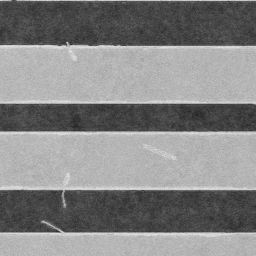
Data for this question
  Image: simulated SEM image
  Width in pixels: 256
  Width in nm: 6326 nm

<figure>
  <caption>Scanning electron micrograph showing lines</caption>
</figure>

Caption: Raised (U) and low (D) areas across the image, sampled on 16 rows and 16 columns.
DDDDDDDDDDDDDDDD
DDDDDDDDDDDDDDDD
DDDDDDDDDDDDDDDD
UUUUUUUUUUUUUUUU
UUUUUUUUUUUUUUUU
UUUUUUUUUUUUUUUU
DDDDDDDDDDDDDDDD
DDDDDDDDDDDDDDDD
UUUUUUUUUUUUUUUU
UUUUUUUUUUUUUUUU
UUUUUUUUUUUUUUUU
UUUUUUUUUUUUUUUU
DDDDDDDDDDDDDDDD
DDDDDDDDDDDDDDDD
DDDDDDDDDDDDDDDD
UUUUUUUUUUUUUUUU